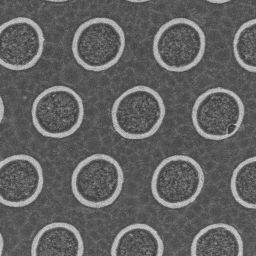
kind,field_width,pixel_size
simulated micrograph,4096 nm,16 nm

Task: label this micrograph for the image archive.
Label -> raised bodies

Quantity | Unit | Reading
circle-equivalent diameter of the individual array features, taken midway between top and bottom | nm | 770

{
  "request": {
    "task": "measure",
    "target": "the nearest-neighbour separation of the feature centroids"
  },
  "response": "1260 nm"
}